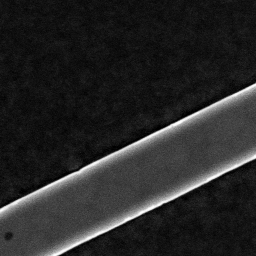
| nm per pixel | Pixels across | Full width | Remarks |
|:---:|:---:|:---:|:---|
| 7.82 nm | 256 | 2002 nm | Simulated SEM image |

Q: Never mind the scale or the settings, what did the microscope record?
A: one or a few lines or trenches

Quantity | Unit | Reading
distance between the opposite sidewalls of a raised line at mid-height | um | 0.52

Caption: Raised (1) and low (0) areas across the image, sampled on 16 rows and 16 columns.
0000000000000000
0000000000000000
0000000000000000
0000000000000000
0000000000000000
0000000000000000
0000000000000111
0000000000011111
0000000001111111
0000000111111111
0000011111111110
0001111111111000
0111111111100000
1111111110000000
1111111000000000
1111000000000000